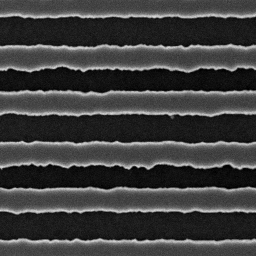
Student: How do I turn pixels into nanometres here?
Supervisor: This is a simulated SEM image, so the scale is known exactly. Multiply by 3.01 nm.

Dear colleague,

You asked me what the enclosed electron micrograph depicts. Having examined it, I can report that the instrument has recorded lines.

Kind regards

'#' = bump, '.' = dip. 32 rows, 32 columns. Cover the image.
################################
################################
................................
................................
................................
................................
################################
################################
#######.########################
................................
................................
##########.#.###################
################################
################################
.........#...............##.....
................................
................................
................................
################################
################################
################################
................................
................................
...........#..##..........#...##
################################
################################
.##########...######..##.####.##
................................
................................
................................
################################
################################